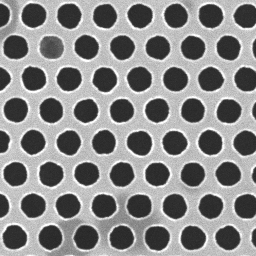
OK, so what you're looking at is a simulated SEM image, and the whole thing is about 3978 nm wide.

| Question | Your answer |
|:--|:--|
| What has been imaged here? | a regular array of holes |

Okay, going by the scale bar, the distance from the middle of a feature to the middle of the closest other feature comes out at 0.549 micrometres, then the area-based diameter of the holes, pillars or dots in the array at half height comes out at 0.387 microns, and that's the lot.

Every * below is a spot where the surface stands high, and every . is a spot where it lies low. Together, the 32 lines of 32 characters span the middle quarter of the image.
********************************
....****....*****....*****....**
....***......***......***......*
.....**......***......***......*
....***......***......***......*
....****.....***......***......*
..*******...*****...******....**
********************************
***********************.********
***.....****....*****.....****..
***.....****.....***......****..
**.......**.......**......***...
**.......***.....***......***...
***.....****.....****.....****..
****...******..*******..*******.
********************************
*.********.*********************
....****....****.....*****....**
....***......***......***......*
.....**......***......**.......*
....***......***......***......*
....****....*****.....***.....**
...*****...*******...*****...***
********************************
*****..*******.********.********
***.....****.....****.....****..
***......***.....***......***...
**.......***......**......***...
***......**.......**......***...
***.....****.....****.....****..
*****.*******...******..*******.
********************************